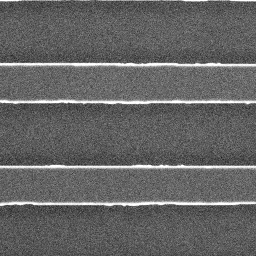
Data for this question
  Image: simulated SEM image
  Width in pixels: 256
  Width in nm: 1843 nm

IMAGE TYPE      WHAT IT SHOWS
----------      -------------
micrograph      lines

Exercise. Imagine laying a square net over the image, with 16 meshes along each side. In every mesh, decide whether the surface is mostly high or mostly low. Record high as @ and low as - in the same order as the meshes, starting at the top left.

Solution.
----------------
----------------
----------------
----------------
@@@@@@@@@@@@@@@@
@@@@@@@@@@@@@@@@
----------------
----------------
----------------
----------------
@@@@@@@@@@@@@@@@
@@@@@@@@@@@@@@@@
@@@@@@@@@@@@@@@@
----------------
----------------
----------------